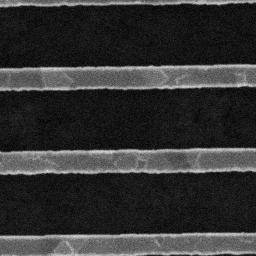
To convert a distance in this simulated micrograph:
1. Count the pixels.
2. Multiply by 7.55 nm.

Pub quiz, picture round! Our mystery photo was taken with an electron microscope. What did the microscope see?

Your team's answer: lines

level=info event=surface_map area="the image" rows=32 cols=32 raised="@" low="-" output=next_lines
@@@@@@@@@@@@@@------------------
--------------------------------
--------------------------------
--------------------------------
--------------------------------
--------------------------------
--------------------------------
--------------------------------
---------------@@@@@@@@@@@@@@@@@
@@@@@@@@@@@@@@@@@@@@@@@@@@@@@@@@
@@@@@@@@@@@@@@@@@@@@@@@@@@@@@@@@
--------------------------------
--------------------------------
--------------------------------
--------------------------------
--------------------------------
--------------------------------
--------------------------------
--------------------------------
@@@@@@@@@@@@@@@@@@@@@@@@@@@@@@@@
@@@@@@@@@@@@@@@@@@@@@@@@@@@@@@@@
@@@@@@@@@@@@@@@@@-@@@@-@@-------
--------------------------------
--------------------------------
--------------------------------
--------------------------------
--------------------------------
--------------------------------
--------------------------------
------@--@@@@@@@@@@@@@@@@@@@@@@@
@@@@@@@@@@@@@@@@@@@@@@@@@@@@@@@@
@@@@@@@@@@@@@@@@@@@@@@@@@@@@@@@@